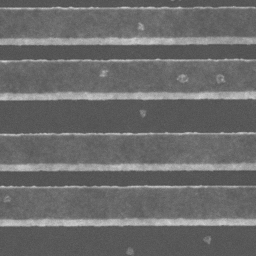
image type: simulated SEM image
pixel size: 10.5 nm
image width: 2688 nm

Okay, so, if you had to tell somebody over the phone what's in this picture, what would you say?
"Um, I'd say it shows lines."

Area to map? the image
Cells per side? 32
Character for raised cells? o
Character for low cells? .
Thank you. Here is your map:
................................
oooooooooooooooooooooooooooooooo
oooooooooooooooooooooooooooooooo
oooooooooooooooooooooooooooooooo
oooooooooooooooooooooooooooooooo
................................
................................
...................o......o.ooo.
oooooooooooooooooooooooooooooooo
oooooooooooooooooooooooooooooooo
oooooooooooooooooooooooooooooooo
oooooooooooooooooooooooooooooooo
................................
................................
................................
................................
................................
oooooooooooooooooooooooooooooooo
oooooooooooooooooooooooooooooooo
oooooooooooooooooooooooooooooooo
oooooooooooooooooooooooooooooooo
................................
................................
oooooooooooooooooooooooooooooooo
oooooooooooooooooooooooooooooooo
oooooooooooooooooooooooooooooooo
oooooooooooooooooooooooooooooooo
oooooooooooooooooooooooooooooooo
................................
................................
................................
................................